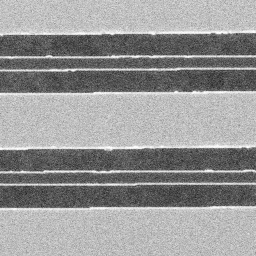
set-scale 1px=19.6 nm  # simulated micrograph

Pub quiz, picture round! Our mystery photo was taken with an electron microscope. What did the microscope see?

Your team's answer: lines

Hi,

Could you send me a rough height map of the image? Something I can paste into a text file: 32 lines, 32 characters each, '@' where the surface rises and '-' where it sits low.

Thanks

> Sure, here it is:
@@@@@@@@@@@@@@@@@@@@@@@@@@@@@@@@
@@@@@@@@@@@@@@@@@@@@@@@@@@@@@@@@
@@@@@@@@@@@@@@@@@@@@@@@@@@@@@@@@
@@@@@@@@@@@@@@@@@@@@@@@@@@@@@@@@
--------------------------------
--------------------------------
--------------------------------
@@@@@@@@@@@@@@@@@@@@@@@@@@@@@@@@
@@@@@@@@@@@@@@@@@@@@@@@@@@@@@@@@
--------------------------------
--------------------------------
--------------------------------
@@@@@@@@@@@@@@@@@@@@@@@@@@@@@@@@
@@@@@@@@@@@@@@@@@@@@@@@@@@@@@@@@
@@@@@@@@@@@@@@@@@@@@@@@@@@@@@@@@
@@@@@@@@@@@@@@@@@@@@@@@@@@@@@@@@
@@@@@@@@@@@@@@@@@@@@@@@@@@@@@@@@
@@@@@@@@@@@@@@@@@@@@@@@@@@@@@@@@
@@@@@@@@@@@@@@@@@@--------------
--------------------------------
--------------------------------
--@--@@@@@@@@@@@@@@@@@@@@@@@@@@@
@@@@@@@@@@@@@@@@@@@@@@@@@@@@@@@@
--------------------------------
--------------------------------
--------------------------------
@@@@@@@@@@@@@@@@@@@@@@@@@@@@@@@@
@@@@@@@@@@@@@@@@@@@@@@@@@@@@@@@@
@@@@@@@@@@@@@@@@@@@@@@@@@@@@@@@@
@@@@@@@@@@@@@@@@@@@@@@@@@@@@@@@@
@@@@@@@@@@@@@@@@@@@@@@@@@@@@@@@@
@@@@@@@@@@@@@@@@@@@@@@@@@@@@@@@@